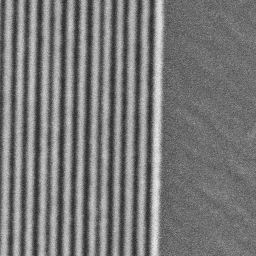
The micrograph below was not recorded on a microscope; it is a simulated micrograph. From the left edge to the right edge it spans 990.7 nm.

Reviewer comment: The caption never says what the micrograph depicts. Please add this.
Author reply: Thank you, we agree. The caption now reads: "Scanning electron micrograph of parallel lines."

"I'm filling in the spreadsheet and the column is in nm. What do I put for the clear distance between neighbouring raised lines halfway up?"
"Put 22.7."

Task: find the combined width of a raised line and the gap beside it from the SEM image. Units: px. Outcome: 12.5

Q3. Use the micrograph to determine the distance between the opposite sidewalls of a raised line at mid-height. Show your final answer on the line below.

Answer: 0.0256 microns